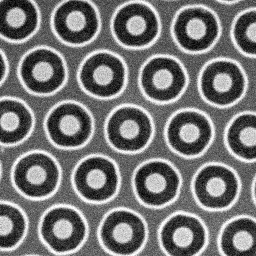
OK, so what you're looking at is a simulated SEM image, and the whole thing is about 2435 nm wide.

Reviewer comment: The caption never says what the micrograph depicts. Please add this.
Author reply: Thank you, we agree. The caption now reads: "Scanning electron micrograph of an array of small figures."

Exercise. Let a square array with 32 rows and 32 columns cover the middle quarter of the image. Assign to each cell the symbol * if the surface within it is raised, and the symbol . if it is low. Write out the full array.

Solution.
****...........*****.........***
****....****...****...........**
.***....****....***....****...**
.***....****...****...*****....*
****....***....****...*****....*
****...........****....***....**
*****.........******..........**
*******.......******.........***
*********..**********.......****
..*********************...******
....***********..***************
.....********.......**********..
......******.........*******....
***....****...........*****.....
***....****....***....****......
****...****...****....****....**
***....***....****....****...***
**.....****...****....****...***
......*****.....*.....****...***
......*****..........*****.....*
....********........******......
*************......********.....
*****************************...
******.....*********************
****........*********.....******
***..........******........*****
***..........*****..........****
**....****....****...........***
**....****....***....****....***
**....****....***....****....***
***....***....****...****....***
***..........*****...****....***